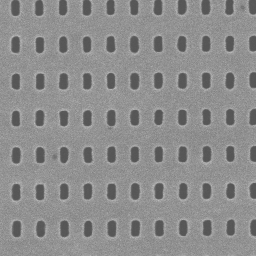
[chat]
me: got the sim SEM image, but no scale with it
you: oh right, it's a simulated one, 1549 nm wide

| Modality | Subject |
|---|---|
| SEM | a regular array of holes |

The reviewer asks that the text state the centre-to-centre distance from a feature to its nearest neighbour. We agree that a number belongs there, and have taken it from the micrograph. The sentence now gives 0.143 um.